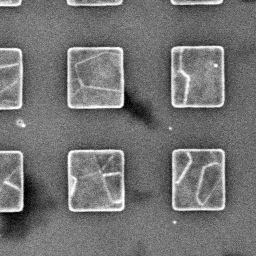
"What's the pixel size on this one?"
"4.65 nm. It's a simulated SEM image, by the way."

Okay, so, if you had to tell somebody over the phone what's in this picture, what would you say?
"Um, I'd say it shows wiring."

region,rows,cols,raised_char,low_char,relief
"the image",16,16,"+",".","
................
................
................
+...++++...+++..
+...++++...+++..
+...++++...+++..
+...+++....+++..
................
................
.....++....+++..
+...++++...+++..
+...++++...+++..
+...++++...+++..
................
................
................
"